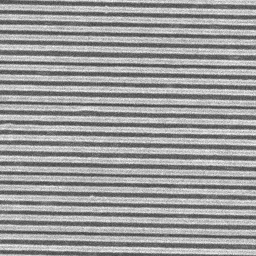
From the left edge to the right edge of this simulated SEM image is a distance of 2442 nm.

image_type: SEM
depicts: parallel lines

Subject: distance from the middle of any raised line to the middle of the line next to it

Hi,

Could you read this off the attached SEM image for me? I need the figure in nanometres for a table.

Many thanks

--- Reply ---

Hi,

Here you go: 95.3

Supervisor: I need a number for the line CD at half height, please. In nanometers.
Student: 40.5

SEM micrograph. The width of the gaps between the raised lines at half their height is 5.87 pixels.